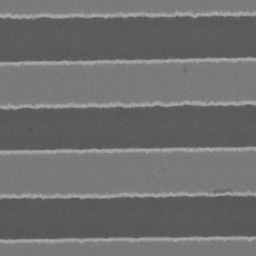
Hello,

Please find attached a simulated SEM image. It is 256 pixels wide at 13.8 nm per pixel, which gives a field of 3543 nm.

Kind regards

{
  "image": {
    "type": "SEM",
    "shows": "lines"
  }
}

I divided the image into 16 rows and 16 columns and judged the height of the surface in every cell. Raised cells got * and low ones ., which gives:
****************
................
................
................
****************
****************
****************
................
................
****************
****************
****************
................
................
................
****************